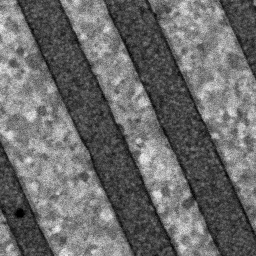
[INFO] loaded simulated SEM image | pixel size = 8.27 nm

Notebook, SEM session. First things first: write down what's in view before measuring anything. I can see one or a few lines or trenches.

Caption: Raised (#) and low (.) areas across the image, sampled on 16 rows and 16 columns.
#...###...####..
##..###...####..
##...###..#####.
###..###...####.
###...##...#####
####..###...####
####...##...####
####...###...###
#####...##...###
#####...###...##
.#####...##...##
.#####...###...#
..#####...##...#
..#####...###...
#..#####..###...
#..#####...##...